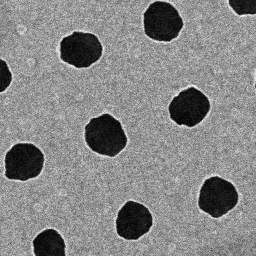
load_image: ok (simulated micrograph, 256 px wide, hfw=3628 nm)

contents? holes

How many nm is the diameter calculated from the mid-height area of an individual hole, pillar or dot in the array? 556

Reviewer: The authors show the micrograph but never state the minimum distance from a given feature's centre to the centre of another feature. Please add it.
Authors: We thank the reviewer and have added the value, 1220 nanometers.